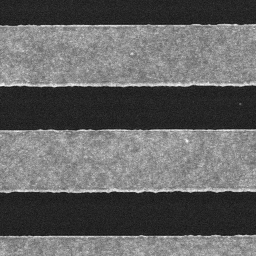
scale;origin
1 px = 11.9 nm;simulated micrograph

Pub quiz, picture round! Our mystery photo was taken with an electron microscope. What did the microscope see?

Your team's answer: lines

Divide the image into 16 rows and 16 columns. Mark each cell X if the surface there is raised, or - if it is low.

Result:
----------------
----------------
XXXXXXXXXXXXXXXX
XXXXXXXXXXXXXXXX
XXXXXXXXXXXXXXXX
----------------
----------------
----------------
XXXXXXXXXXXXXXXX
XXXXXXXXXXXXXXXX
XXXXXXXXXXXXXXXX
XXXXXXXXXXXXXXXX
----------------
----------------
----------------
XXXXXXXXXXXXXXXX